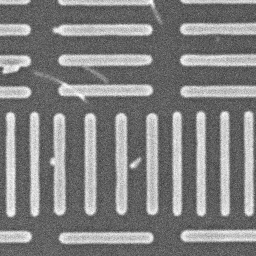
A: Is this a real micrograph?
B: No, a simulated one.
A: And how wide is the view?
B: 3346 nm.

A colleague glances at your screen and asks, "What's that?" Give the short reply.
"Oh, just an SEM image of groups of lines, slits or small figures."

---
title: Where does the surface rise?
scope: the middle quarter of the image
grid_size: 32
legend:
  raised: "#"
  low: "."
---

................................
................................
................................
................................
................................
#.....###############...........
######################.......###
######################.......###
................................
................................
................................
................................
............................#...
......##.....##......##....##...
......##.....##......##....##...
......##.....##......##....##...
......##.....##......##....##...
......##.....##......##....##...
......##.....##......##....##...
......##.....##......##....##...
......##.....##......##....##...
......##.....##......##....##...
......##.....###.....##....##...
......##.....###.....##....##...
......##.....###.....##....##...
......##.....###.....##....##...
......##.....###.....##....##...
......##.....###.....##....##...
......##.....###.....##....##...
......##.....##......##.....#...
......##.....##......##.....#...
......##.....##......##.....#...